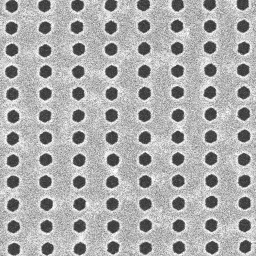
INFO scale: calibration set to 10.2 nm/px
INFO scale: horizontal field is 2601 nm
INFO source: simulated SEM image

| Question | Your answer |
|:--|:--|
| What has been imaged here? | a regular array of holes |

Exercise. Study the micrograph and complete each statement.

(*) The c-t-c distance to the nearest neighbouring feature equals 0.223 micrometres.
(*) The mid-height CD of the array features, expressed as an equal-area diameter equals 135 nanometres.